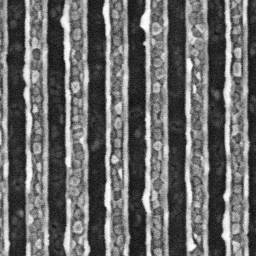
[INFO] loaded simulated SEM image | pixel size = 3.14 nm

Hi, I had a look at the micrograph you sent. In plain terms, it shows parallel lines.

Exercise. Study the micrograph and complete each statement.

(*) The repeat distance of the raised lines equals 126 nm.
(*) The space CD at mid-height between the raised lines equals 0.0582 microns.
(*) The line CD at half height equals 68.6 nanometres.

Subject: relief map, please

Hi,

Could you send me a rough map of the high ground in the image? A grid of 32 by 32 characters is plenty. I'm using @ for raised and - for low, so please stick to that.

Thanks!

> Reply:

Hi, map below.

@--@@@--@@@--@@@--@@@--@@@--@@@-
@--@@@--@@@--@@@--@@@--@@@--@@@-
@--@@@--@@@--@@@--@@@--@@@--@@@-
@--@@@--@@@--@@@--@@@--@@@--@@@-
@--@@@--@@@--@@@--@@@--@@@--@@@-
@--@@@--@@@--@@@--@@@--@@@--@@@-
@--@@@--@@@--@@@--@@@--@@@--@@@-
@--@@@--@@@--@@@--@@@--@@@--@@@-
@--@@@--@@@--@@@--@@@--@@@--@@@-
@--@@@--@@@--@@@--@@@--@@@--@@@-
@--@@@--@@@--@@@--@@@--@@@--@@@-
@--@@@--@@@--@@@--@@@--@@@--@@@-
@--@@@--@@@--@@@--@@@--@@@--@@@-
@--@@@--@@@--@@@--@@@--@@@--@@@-
@--@@@--@@@--@@@--@@@--@@@--@@@-
@--@@@--@@@--@@@--@@@--@@@--@@@-
@--@@@--@@@--@@@--@@@--@@@--@@@-
@--@@@--@@@--@@@--@@@--@@@--@@@-
@--@@@--@@@--@@@--@@@--@@@--@@@-
@--@@@--@@@--@@@--@@@--@@@--@@@-
@--@@@--@@@--@@@--@@@--@@@--@@@-
@--@@@--@@@--@@@--@@@--@@@--@@@-
@--@@@--@@@--@@@--@@@--@@@--@@@-
@--@@@--@@@--@@@--@@@--@@@--@@@-
@--@@@--@@@--@@@--@@@--@@@--@@@-
@--@@@--@@@--@@@--@@@--@@@--@@@-
@--@@@--@@@--@@@--@@@--@@@--@@@-
@--@@@--@@@--@@@--@@@--@@@--@@@-
@--@@@--@@@--@@@--@@@--@@@--@@@-
@--@@@--@@@--@@@--@@@--@@@--@@@-
@--@@@--@@@--@@@--@@@--@@@--@@@-
@--@@@--@@@--@@@--@@@--@@@--@@@-